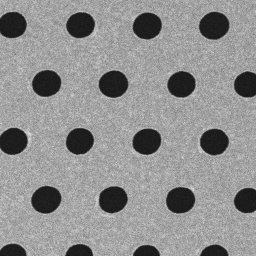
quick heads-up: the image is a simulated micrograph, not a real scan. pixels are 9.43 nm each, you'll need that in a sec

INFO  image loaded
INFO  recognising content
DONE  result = a regular array of holes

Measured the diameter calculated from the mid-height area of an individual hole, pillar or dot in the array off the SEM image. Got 263 nm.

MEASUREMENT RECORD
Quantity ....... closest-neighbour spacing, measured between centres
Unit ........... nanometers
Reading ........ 628